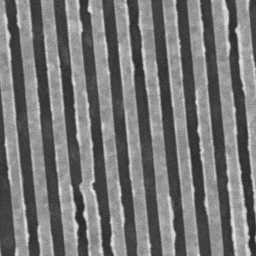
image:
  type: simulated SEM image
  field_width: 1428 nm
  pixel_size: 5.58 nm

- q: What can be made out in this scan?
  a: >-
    parallel lines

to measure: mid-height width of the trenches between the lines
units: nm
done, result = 65.9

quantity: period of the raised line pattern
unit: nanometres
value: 135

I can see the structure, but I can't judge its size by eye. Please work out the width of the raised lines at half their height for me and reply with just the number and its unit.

0.0701 micrometres